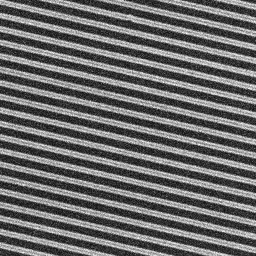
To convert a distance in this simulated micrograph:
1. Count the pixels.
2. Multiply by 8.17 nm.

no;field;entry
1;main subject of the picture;parallel lines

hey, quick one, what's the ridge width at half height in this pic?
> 28.9 nm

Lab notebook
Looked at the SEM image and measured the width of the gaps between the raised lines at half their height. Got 0.0796 micrometres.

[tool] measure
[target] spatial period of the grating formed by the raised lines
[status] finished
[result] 108 nanometres